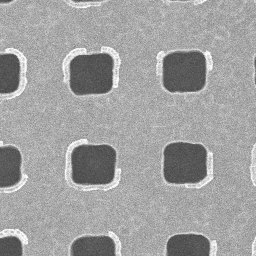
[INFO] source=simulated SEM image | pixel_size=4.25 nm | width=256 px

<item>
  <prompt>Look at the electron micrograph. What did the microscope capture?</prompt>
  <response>holes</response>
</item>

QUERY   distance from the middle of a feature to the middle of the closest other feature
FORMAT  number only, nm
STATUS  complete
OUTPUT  386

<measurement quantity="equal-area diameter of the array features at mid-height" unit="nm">194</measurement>